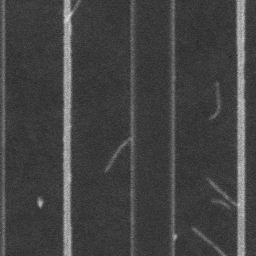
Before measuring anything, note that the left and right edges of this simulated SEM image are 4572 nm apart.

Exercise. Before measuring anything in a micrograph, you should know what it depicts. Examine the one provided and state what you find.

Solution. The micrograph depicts lines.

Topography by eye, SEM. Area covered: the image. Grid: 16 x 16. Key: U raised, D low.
DDDDDDDDUUUDDDDD
DDDDDDDDUUUDDDDD
DDDDDDDDUUUDDDDD
DDDDDDDDUUUDDDDD
DDDDDDDDUUUDDDDD
DDDDDDDDUUUDDDDD
DDDDDDDDUUUDDDDD
DDDDDDDDUUUDDDDD
DDDDDDDDUUUDDDDD
DDDDDDDDUUUDDDDD
DDDDDDDDUUUDDDDD
DDDDDDDDUUUDDDDD
DDDDDDDDUUUDDDDD
DDDDDDDDUUUDDDDD
DDDDDDDDUUUDDDDD
DDDDDDDDUUUDDDDD